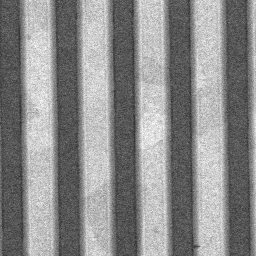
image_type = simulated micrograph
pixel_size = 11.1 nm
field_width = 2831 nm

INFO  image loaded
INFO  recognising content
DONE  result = parallel lines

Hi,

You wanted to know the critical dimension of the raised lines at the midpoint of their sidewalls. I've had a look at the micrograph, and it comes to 326 nm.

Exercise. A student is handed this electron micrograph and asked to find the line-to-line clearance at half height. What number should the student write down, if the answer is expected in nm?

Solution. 307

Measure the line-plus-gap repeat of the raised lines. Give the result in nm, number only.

627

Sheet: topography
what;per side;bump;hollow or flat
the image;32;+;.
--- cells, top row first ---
...+++....++++...++++...++++...+
...+++....++++...++++...++++...+
...+++....++++...++++...++++...+
...+++....++++...++++...++++...+
...+++....++++...++++...++++...+
...+++....++++...++++...++++...+
...++++...++++...++++...++++...+
...++++...++++...++++...++++...+
...++++...++++...++++...++++...+
...++++...++++...++++...++++....
...++++...++++...++++...++++...+
...++++...++++...++++...++++...+
...++++...++++...++++...++++...+
...++++...++++...++++...++++...+
...++++...++++...++++...++++...+
...++++...++++...++++...++++...+
...++++...++++...++++...++++...+
...++++...++++...++++...++++....
...++++...++++...++++...++++....
...++++...++++...++++...++++....
...++++...++++...++++....+++....
...++++...++++...++++....+++....
...++++...++++...++++....+++....
...++++...++++...++++....+++....
...++++...++++....+++....+++....
...++++...++++....+++....+++....
...++++...++++....+++....+++....
...++++...++++....+++....+++....
...++++...++++....+++....+++....
...++++...++++....+++....+++....
...++++...++++....+++....+++....
...++++...++++....+++....+++....